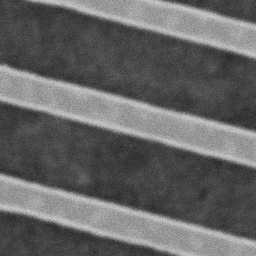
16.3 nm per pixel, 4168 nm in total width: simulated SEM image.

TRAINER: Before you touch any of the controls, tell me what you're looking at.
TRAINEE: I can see one or a few lines or trenches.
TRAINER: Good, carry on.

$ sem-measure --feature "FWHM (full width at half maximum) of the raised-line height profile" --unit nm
467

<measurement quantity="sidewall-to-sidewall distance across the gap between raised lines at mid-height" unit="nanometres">1250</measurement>